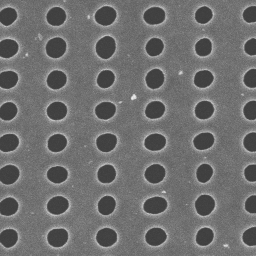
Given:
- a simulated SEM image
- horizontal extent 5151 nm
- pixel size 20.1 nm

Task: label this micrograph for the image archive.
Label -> a regular array of holes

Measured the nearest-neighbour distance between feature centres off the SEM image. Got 632 nm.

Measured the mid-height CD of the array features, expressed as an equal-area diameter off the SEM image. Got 391 nanometres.